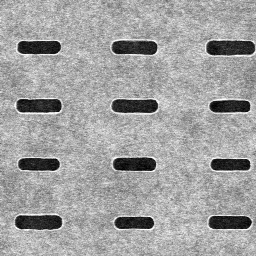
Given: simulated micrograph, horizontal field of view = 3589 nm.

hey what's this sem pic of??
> a regular array of holes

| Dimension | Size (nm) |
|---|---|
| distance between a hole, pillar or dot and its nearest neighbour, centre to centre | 815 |